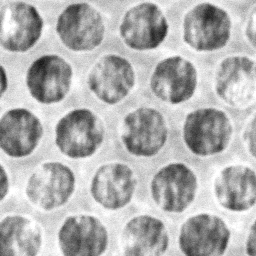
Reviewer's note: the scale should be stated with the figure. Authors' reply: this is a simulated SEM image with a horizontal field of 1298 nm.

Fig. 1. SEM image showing a regular array of holes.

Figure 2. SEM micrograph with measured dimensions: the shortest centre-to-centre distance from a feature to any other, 306 nanometers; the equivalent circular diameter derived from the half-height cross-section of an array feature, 247 nanometers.